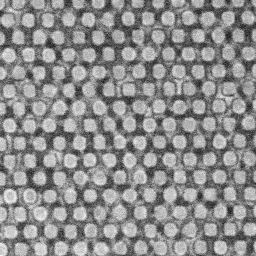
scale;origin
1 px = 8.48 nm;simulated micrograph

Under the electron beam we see a regular array of raised bodies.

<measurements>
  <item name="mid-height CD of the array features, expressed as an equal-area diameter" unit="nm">106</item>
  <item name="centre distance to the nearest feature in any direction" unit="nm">167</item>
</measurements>